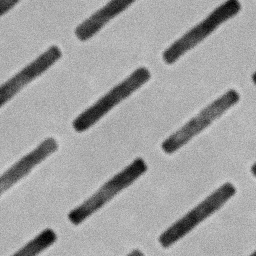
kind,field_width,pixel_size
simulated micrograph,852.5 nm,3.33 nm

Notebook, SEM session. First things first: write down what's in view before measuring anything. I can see holes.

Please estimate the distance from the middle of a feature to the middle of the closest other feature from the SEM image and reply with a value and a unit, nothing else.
306 nm